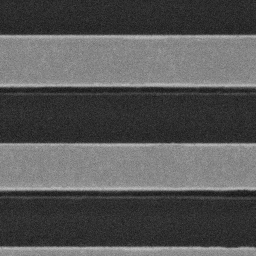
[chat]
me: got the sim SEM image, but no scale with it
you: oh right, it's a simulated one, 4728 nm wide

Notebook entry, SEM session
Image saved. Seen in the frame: lines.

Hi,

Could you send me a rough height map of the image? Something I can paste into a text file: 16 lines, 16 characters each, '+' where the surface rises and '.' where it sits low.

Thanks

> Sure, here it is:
................
................
++++++++++++++++
++++++++++++++++
++++++++++++++++
................
................
................
................
++++++++++++++++
++++++++++++++++
++++++++++++++++
................
................
................
................